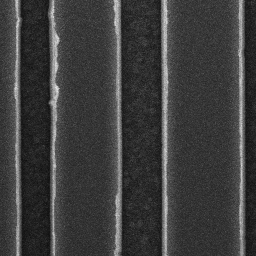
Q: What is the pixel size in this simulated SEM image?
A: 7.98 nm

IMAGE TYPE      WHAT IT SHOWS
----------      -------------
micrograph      one or a few lines or trenches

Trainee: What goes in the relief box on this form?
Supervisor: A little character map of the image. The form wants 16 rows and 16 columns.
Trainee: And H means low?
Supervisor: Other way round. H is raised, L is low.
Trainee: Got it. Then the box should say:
HLLHHHHLLLHHHHHL
HLLHHHHLLLHHHHHL
HLLHHHHLLLHHHHHL
HLLHHHHLLLHHHHHL
HLLHHHHLLLHHHHHL
HLLHHHHLLLHHHHHL
HLLHHHHLLLHHHHHL
HLLHHHHLLLHHHHHL
HLLHHHHLLLHHHHHL
HLLHHHHLLLHHHHHL
HLLHHHHLLLHHHHHL
HLLHHHHLLLHHHHHL
HLLHHHHLLLHHHHHL
HLLHHHHLLLHHHHHL
HLLHHHHLLLHHHHHL
HLLHHHHLLLHHHHHL